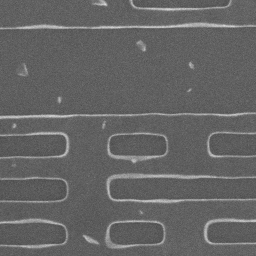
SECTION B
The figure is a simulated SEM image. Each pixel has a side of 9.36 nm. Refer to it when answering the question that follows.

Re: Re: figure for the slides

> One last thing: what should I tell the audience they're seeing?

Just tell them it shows groups of lines, slits or small figures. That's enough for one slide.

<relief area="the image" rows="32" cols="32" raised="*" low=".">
*****************............***
********************************
********************************
**..............................
................................
................................
................................
................................
................................
................................
................................
................................
................................
................................
.........***********************
********************************
********************************
........******.......*****......
........******.......*****......
.......*******......*******.*..*
********************************
********************************
........******..................
........******..................
........******..................
********************************
********************************
********************************
........******......******......
........*****........*****......
.......*******......*******..***
********************************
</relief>